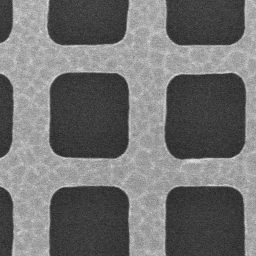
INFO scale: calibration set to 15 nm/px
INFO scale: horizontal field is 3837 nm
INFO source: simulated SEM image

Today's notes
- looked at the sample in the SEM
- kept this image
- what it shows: holes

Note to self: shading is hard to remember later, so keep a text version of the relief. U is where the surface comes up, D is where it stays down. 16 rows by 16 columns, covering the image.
DUUDDDDDUUDDDDDU
DUUDDDDDUUDDDDDU
UUUDDDDUUUUDDDDU
UUUUUUUUUUUUUUUU
UUUUUDUUUUUUUUUU
DUUDDDDDUUDDDDDU
DUUDDDDDUUDDDDDU
DUUDDDDDUUDDDDDU
DUUDDDDDUUDDDDDU
UUUDDDDDUUUDDDDU
UUUUUUUUUUUUUUUU
UUUUUUUUUUUUUUUU
DUUDDDDDUUDDDDDU
DUUDDDDDUUDDDDDU
DUUDDDDDUUDDDDDU
DUUDDDDDUUDDDDDU